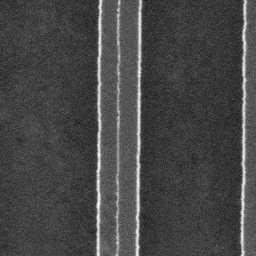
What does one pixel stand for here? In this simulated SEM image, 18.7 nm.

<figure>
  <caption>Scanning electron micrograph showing lines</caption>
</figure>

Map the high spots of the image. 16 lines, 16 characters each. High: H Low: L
LLLLLLHHHLLLLLLH
LLLLLLHHHLLLLLLH
LLLLLLHHHLLLLLLH
LLLLLLHHHLLLLLLH
LLLLLLHHHLLLLLLH
LLLLLLHHHLLLLLLH
LLLLLLHHHLLLLLLH
LLLLLLHHHLLLLLLH
LLLLLLHHHLLLLLLH
LLLLLLHHHLLLLLLH
LLLLLLHHHLLLLLLH
LLLLLLHHHLLLLLLH
LLLLLLHHHLLLLLLH
LLLLLLHHHLLLLLLH
LLLLLLHHHLLLLLLH
LLLLLLHHHLLLLLLH